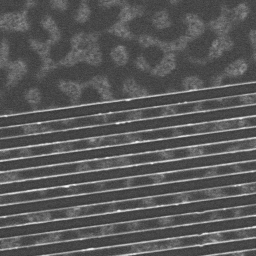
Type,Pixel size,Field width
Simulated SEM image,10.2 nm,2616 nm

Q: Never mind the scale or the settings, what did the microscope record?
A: parallel lines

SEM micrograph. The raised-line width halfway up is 119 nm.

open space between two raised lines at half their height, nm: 110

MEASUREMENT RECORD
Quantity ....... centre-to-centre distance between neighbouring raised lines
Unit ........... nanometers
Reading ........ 225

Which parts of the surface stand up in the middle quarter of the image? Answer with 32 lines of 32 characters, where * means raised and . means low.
********************************
********************************
********************************
********************************
********************************
********************************
********************************
***************************.....
*******************.............
************....................
****....................********
.................***************
........**********************..
..*********************.........
*****************...............
********.....................***
*.....................**********
...............*****************
.......*******************......
*******************.............
***********.....................
****.....................*******
..................**************
..........*********************.
...*********************........
****************................
*********.....................**
**.....................*********
................****************
........*******************.....
.*******************............
*************...................